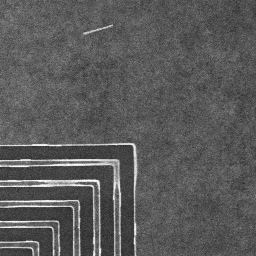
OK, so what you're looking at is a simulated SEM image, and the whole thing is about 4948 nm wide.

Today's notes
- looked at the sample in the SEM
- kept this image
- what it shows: groups of lines, slits or small figures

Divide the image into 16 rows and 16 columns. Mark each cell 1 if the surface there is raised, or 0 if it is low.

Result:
1111111111111111
1111111111111111
1111111111111111
1111111111111111
1111111111111111
1111111111111111
1111111111111111
1111111111111111
1111111111111111
0000000011111111
0000000011111111
0000000011111111
0000000011111111
0000000011111111
0001000011111111
0000000011111111